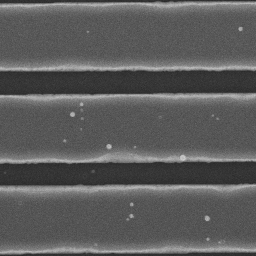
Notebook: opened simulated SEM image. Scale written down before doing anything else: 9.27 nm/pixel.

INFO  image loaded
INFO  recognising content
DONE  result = lines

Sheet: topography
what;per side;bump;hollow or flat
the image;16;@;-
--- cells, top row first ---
@@@@@@@@@@@@@@@@
@@@@@@@@@@@@@@@@
@@@@@@@@@@@@@@@@
@@@@@@@@@@@@@@@@
----------------
----------------
@@@@@@@@@@@@@@@@
@@@@@@@@@@@@@@@@
@@@@@@@@@@@@@@@@
@@@@@@@@@@@@@@@@
----------------
----------------
@@@@@@@@@@@@@@@@
@@@@@@@@@@@@@@@@
@@@@@@@@@@@@@@@@
@@@@@@@@@@@@@@@@